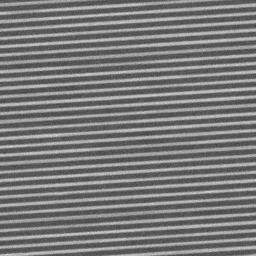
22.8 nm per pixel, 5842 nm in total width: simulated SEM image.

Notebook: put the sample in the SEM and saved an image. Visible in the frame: parallel lines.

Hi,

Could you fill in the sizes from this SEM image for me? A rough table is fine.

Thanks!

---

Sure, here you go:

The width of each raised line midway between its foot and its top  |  39.8 nanometres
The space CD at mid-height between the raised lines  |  140 nm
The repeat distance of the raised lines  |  190 nm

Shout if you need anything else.